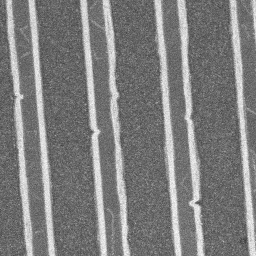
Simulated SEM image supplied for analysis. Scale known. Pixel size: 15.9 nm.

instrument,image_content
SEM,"one or a few lines or trenches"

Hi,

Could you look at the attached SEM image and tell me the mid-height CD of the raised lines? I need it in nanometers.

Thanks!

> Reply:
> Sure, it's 354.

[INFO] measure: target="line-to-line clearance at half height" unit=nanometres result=830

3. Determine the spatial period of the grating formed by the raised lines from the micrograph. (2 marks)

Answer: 1180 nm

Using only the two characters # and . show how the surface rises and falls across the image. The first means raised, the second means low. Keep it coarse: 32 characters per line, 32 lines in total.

.###.......##.......###......###
.###.......##.......###......###
.###.......###......###......###
.###.......###......###......###
.###.......###......###......###
.###.......###......###.......##
..##.......###......###.......##
..##.......###......###.......##
..###......###.......##.......##
..###......###.......##.......##
..###......###.......##.......##
..###......###.......##.......##
..###.......##.......##.......##
..###.......##.......###......##
..###.......##.......##.......##
..###.......##.......###......##
...##.......##.......###......##
...##.......###......###.......#
...##.......###......###.......#
...##.......###......###.......#
...###......###......###.......#
...###......###......###.......#
...###......###.......##.......#
...###......###.......###......#
...###......###.......###......#
...###.......##.......##.......#
...###.......###......###......#
...###.......###......###......#
...###.......###......###......#
....##.......###......###......#
....##.......###......###.......
....##.......###......###.......